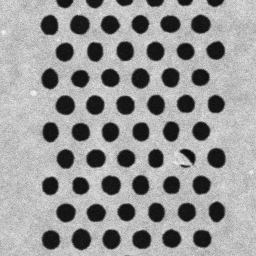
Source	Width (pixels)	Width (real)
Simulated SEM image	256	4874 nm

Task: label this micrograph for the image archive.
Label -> a regular array of holes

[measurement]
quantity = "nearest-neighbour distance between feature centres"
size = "572 nm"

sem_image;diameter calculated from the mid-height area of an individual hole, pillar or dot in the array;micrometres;0.359